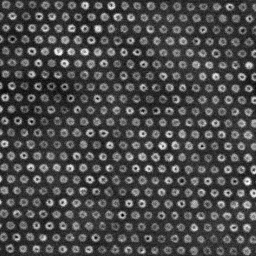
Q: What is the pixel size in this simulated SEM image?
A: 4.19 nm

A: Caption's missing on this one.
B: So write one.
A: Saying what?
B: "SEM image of a regular array of raised bodies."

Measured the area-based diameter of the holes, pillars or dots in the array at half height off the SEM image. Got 29.2 nanometers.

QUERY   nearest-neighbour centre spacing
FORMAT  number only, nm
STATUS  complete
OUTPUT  54